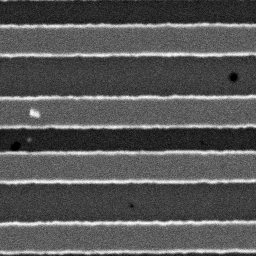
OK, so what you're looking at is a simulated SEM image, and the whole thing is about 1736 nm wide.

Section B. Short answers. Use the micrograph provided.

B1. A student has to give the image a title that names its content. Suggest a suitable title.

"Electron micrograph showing lines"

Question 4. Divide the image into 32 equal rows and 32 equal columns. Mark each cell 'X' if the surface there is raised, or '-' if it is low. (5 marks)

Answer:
--------------------------------
--------------------------------
--------------------------------
XXXXXXXXXXXXXXXXXXXXXXXXXXXXXXXX
XXXXXXXXXXXXXXXXXXXXXXXXXXXXXXXX
XXXXXXXXXXXXXXXXXXXXXXXXXXXXXXXX
XXXXXXXXXXXXXXXXXXXXXXXXXXXXXXXX
--------------------------------
--------------------------------
--------------------------------
--------------------------------
--------------------------------
XXXXXXXXXXXXXXXXXXXXXXXXXXXXXXXX
XXXXXXXXXXXXXXXXXXXXXXXXXXXXXXXX
XXXXXXXXXXXXXXXXXXXXXXXXXXXXXXXX
XXXXXXXXXXXXXXXXXXXXXXXXXXXXXXXX
--------------------------------
--------------------------------
--------------------------------
XXXXXXXXXXXXXXXXXXXXXXXXXXXXXXXX
XXXXXXXXXXXXXXXXXXXXXXXXXXXXXXXX
XXXXXXXXXXXXXXXXXXXXXXXXXXXXXXXX
XXXXXXXXXXXXXXXXXXXXXXXXXXXXXXXX
--------------------------------
--------------------------------
--------------------------------
--------------------------------
--------------------------------
XXXXXXXXXXXXXXXXXXXXXXXXXXXXXXXX
XXXXXXXXXXXXXXXXXXXXXXXXXXXXXXXX
XXXXXXXXXXXXXXXXXXXXXXXXXXXXXXXX
XXXXXXXXXXXXXXXXXXXXXXXX---X----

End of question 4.